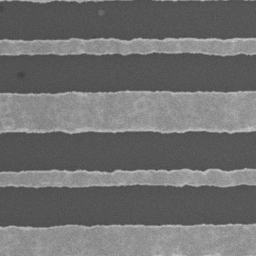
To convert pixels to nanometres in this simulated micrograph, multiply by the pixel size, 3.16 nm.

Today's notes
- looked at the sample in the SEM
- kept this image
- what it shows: lines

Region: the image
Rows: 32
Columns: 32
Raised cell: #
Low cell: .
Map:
................................
................................
................................
................................
................................
################################
###################.############
................................
................................
................................
................................
...............######.....#...##
################################
################################
################################
################################
#..###..##..........###.....##..
................................
................................
................................
................................
...########...##############.###
################################
................................
................................
................................
................................
................................
####..##########################
################################
################################
################################